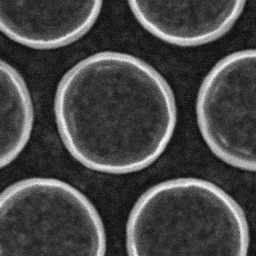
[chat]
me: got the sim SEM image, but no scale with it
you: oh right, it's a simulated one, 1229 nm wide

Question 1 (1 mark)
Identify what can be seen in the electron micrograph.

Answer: raised bodies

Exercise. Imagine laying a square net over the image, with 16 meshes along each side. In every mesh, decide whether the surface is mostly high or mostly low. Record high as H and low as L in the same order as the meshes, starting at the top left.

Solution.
HHHHHHLLHHHHHHHL
HHHHHLLLLHHHHHLL
LHHHLLLLLLLHLLLL
LLLLLLHLLLLLLLLH
HLLLLHHHHLLLLHHH
HLLLHHHHHHLLLHHH
HHLLHHHHHHHLLHHH
HHLLHHHHHHHLLHHH
HHLLHHHHHHLLLHHH
HLLLLHHHHHLLLLHH
LLLLLLHHLLLLLLLL
LLHHLLLLLLLHHLLL
HHHHHLLLLHHHHHLL
HHHHHHLLHHHHHHHL
HHHHHHLLHHHHHHHL
HHHHHHLLHHHHHHHL